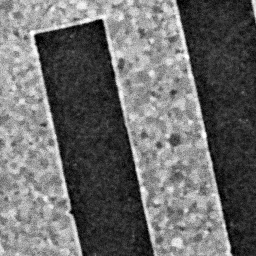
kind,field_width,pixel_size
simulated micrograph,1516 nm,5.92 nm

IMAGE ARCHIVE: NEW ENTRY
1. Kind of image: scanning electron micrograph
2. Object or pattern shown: one or a few lines or trenches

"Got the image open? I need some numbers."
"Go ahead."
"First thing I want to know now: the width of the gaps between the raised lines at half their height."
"435 nanometers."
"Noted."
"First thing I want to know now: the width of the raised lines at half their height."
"0.435 microns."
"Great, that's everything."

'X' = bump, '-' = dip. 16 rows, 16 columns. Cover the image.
XXXXXXXXXXX-----
XXXXX-XXXXX-----
XX-----XXXX-----
XX-----XXXXX----
XXX----XXXXX----
XXX----XXXXX----
XXX-----XXXX----
XXX-----XXXXX---
XXX-----XXXXX---
XXXX----XXXXX---
XXXX-----XXXX---
XXXX-----XXXX---
XXXX-----XXXXX--
XXXX-----XXXXX--
XXXXX----XXXXX--
XXXXX-----XXXX--